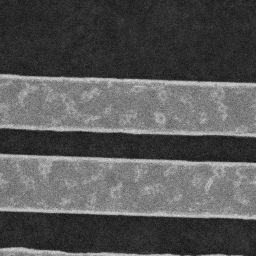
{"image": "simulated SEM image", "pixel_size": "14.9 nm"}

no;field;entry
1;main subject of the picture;one or a few lines or trenches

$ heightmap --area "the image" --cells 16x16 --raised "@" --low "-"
----------------
----------------
----------------
----------------
----------------
@@@@@@@@@@@@@@@@
@@@@@@@@@@@@@@@@
@@@@@@@@@@@@@@@@
----------------
----------------
@@@@@@@@@@@@@@@@
@@@@@@@@@@@@@@@@
@@@@@@@@@@@@@@@@
--------------@@
----------------
----------------